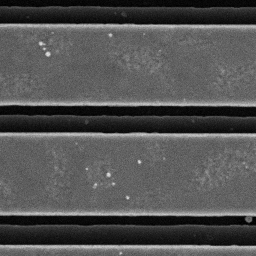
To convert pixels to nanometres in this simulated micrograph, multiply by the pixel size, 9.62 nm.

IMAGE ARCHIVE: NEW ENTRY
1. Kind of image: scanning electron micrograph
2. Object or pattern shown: lines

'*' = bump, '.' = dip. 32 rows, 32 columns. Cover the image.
................................
................................
................................
********************************
********************************
********************************
********************************
********************************
********************************
********************************
********************************
********************************
********************************
................................
................................
................................
................................
********************************
********************************
********************************
********************************
********************************
********************************
********************************
********************************
********************************
********************************
................................
................................
................................
................................
********************************